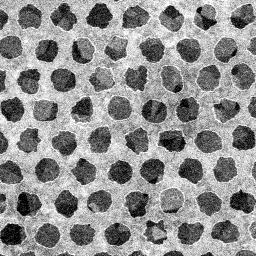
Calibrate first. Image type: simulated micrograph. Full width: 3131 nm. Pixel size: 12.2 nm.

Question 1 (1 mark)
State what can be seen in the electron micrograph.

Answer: a regular array of raised bodies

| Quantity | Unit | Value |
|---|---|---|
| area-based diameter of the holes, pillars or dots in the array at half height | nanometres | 317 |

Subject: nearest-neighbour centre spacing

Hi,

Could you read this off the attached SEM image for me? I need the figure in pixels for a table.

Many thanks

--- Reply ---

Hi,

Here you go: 33.7